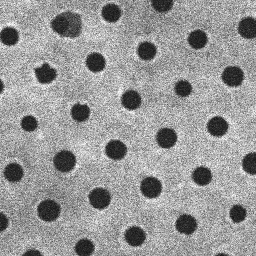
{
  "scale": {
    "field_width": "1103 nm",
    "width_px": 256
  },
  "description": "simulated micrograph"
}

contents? a regular array of holes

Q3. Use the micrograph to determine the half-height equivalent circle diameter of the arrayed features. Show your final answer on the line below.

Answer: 87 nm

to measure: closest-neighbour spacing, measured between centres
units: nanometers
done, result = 221